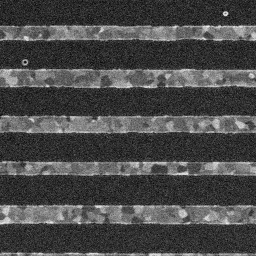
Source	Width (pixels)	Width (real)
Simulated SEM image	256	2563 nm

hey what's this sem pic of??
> lines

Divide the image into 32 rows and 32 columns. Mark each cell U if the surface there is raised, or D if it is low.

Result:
DDDDDDDDDDDDDDDDDDDDDDDDDDDDDDDD
DDDDDDDDDDDDDDDDDDDDDDDDDDDDDDDD
DDDDDDDDDDDDDDDDDDDDDDDDDDDDDDDD
UUUUUUUUUUUUUUUUUUUUUUUUUUUUUUUU
UUUUUUUUUUUUUUUUUUUUUUUUUUUUUUUU
DDDDDDDDDDDDDDDDDDDDDDDDDDDDDDDD
DDDDDDDDDDDDDDDDDDDDDDDDDDDDDDDD
DDDDDDDDDDDDDDDDDDDDDDDDDDDDDDDD
DDDDDDDDDDDDDDDDDDDDDDDDDDDDDDDD
UUUUUUUUUUUUUUUUUUUUUUUUUUUUUUUU
UUUUUUUUUUUUUUUUUUUUUUUUUUUUUUUU
DDDDDDDDDDDDDDDDDDDDDDDDDDDDDDDD
DDDDDDDDDDDDDDDDDDDDDDDDDDDDDDDD
DDDDDDDDDDDDDDDDDDDDDDDDDDDDDDDD
DDDDDDDDDDDDDDDDDDDDDDDDDDDDDDDD
UUUUUUUUUUUUUUUUUUUUUUUUUUUUUUUU
UDDUUUUUUUUUUUUUDUUUUDDUUUUUUUUU
DDDDDDDDDDDDDDDDDDDDDDDDDDDDDDDD
DDDDDDDDDDDDDDDDDDDDDDDDDDDDDDDD
DDDDDDDDDDDDDDDDDDDDDDDDDDDDDDDD
UUUUUUUUUUUUUUUUUUUUUUUUUUUUUUUU
UUUUUUUUUUUUUUUUUUUUUUUUUUUUUUUU
DDDDDDDDDDDDDDDDDDDDDDDDDDDDDDDD
DDDDDDDDDDDDDDDDDDDDDDDDDDDDDDDD
DDDDDDDDDDDDDDDDDDDDDDDDDDDDDDDD
DDDDDDDDDDDDDDDDDDDDDDDDDDDDDDDD
UUUUUUUUUUUUUUUUUUUUUUUUUUUUUUUU
UUUUUUUUUUUUUUUUUUUUUUUUUUUUUUUU
DDDDDDDDDDDDDDDDDDDDDDDDDDDDDDDD
DDDDDDDDDDDDDDDDDDDDDDDDDDDDDDDD
DDDDDDDDDDDDDDDDDDDDDDDDDDDDDDDD
DDDDDDDDDDDDDDDDDDDDDDDDDDDDDDDD